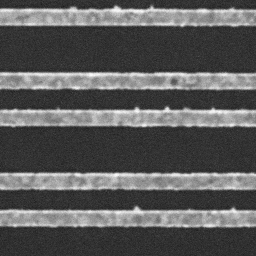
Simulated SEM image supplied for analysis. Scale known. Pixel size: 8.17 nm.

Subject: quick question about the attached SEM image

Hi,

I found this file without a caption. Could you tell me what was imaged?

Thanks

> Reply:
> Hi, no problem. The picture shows lines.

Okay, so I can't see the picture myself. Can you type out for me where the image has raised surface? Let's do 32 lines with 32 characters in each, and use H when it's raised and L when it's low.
LLLLLLLLLLLLLLLLLLLLLLLLLLLLLLLL
HHHHHHHHHHHHHHHHHHHHHHHHHHHHHHHH
HHHHHHHHHHHHHHHHHHHHHHHHHHHHHHHH
LLLLLLLLLLLLLLLLLLLLLLLLLLLLLLLL
LLLLLLLLLLLLLLLLLLLLLLLLLLLLLLLL
LLLLLLLLLLLLLLLLLLLLLLLLLLLLLLLL
LLLLLLLLLLLLLLLLLLLLLLLLLLLLLLLL
LLLLLLLLLLLLLLLLLLLLLLLLLLLLLLLL
LLLLLLLLLLLLLLLLLLLLLLLLLLLLLLLL
HHHHHHHHHHHHHHHHHHHHHHHHHHHHHHHH
HHHHHHHHHHHHHHHHHHHHHHHHHHHHHHHH
LLLLLLLLLLLLLLLLLLLLLLLLLLLLLLLL
LLLLLLLLLLLLLLLLLLLLLLLLLLLLLLLL
LLLLLLLLLLLLLLLLLLLLLLLLLLLLLLLL
HHHHHHHHHHHHHHHHHHHHHHHHHHHHHHHH
HHHHHHHHHHHHHHHHHHHHHHHHHHHHHHHH
LLLLLLLLLLLLLLLLLLLLLLLLLLLLLLLL
LLLLLLLLLLLLLLLLLLLLLLLLLLLLLLLL
LLLLLLLLLLLLLLLLLLLLLLLLLLLLLLLL
LLLLLLLLLLLLLLLLLLLLLLLLLLLLLLLL
LLLLLLLLLLLLLLLLLLLLLLLLLLLLLLLL
LLLLLLLLLLLLLLLLLLLLLLLLLLLLLLLL
HHHHHHHHHHHHHHHHHHHHHHHHHHHHHHHH
HHHHHHHHHHHHHHHHHHHHHHHHHHHHHHHH
LLLLLLLLLLLLLLLLLLLLLLLLLLLLLLLL
LLLLLLLLLLLLLLLLLLLLLLLLLLLLLLLL
HHHHHHHHHHHHHHHHHHHHHHHHHHHHHHHH
HHHHHHHHHHHHHHHHHHHHHHHHHHHHHHHH
LLLLLLLLLLLLLLLLLLLLLLLLLLLLLLLL
LLLLLLLLLLLLLLLLLLLLLLLLLLLLLLLL
LLLLLLLLLLLLLLLLLLLLLLLLLLLLLLLL
LLLLLLLLLLLLLLLLLLLLLLLLLLLLLLLL